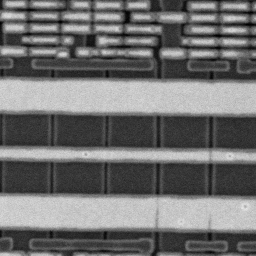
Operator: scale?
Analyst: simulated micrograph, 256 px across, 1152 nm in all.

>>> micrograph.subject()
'wiring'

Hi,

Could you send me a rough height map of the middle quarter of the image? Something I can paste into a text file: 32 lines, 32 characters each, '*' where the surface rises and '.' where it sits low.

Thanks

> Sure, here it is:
**********************.........*
...............................*
................................
................................
********************************
********************************
********************************
********************************
********************************
********************************
********************************
********************************
.*******************************
................................
................................
................................
................................
................................
................................
................................
................................
********************************
********************************
********************************
....................************
................................
................................
................................
................................
................................
................................
................................